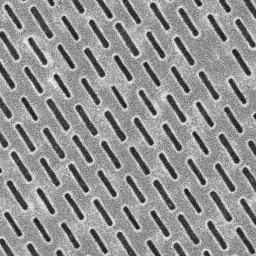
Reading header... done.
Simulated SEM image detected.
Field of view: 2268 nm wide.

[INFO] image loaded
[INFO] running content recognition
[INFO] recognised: a regular array of holes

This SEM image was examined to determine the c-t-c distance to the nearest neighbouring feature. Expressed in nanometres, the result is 256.